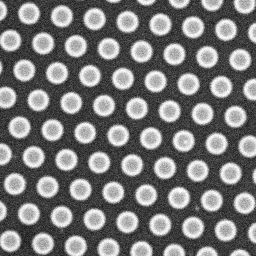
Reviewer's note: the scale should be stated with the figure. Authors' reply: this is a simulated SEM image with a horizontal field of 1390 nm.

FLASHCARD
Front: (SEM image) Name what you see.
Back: an array of small figures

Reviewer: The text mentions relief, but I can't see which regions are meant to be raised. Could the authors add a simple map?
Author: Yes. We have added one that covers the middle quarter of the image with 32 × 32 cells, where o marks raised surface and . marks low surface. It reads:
................................
o...ooooo....ooo................
o...ooooo....oooo....oooo.......
....ooooo...ooooo....oooo....ooo
....ooooo...ooooo...ooooo....ooo
.............ooo.....oooo....ooo
......................oo.....ooo
.oo.............................
oooo....oooo....................
oooo....oooo....oooo.....oo.....
oooo....oooo....ooooo...ooooo...
oooo....oooo....ooooo...ooooo...
.........oo.....oooo....ooooo...
.................oo......ooo....
................................
....ooo......o..................
...ooooo...ooooo....ooo.........
...ooooo...ooooo...ooooo....oooo
...oooo....ooooo...ooooo....oooo
....oo......oooo...ooooo...ooooo
....................ooo.....oooo
.............................oo.
ooo.....oo......................
ooo....oooo....oooo.............
ooo...ooooo....oooo....oooo.....
ooo...ooooo....oooo....ooooo...o
.......oooo....oooo....ooooo...o
................oo.....oooo....o
................................
..oooo..........................
..ooooo...oooo......oo..........
..ooooo...ooooo...ooooo....ooo..